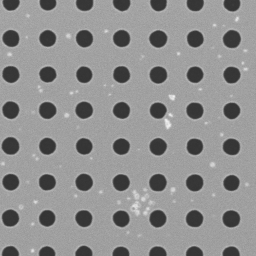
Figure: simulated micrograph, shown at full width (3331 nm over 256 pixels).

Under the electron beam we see a regular array of holes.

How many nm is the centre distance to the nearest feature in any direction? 467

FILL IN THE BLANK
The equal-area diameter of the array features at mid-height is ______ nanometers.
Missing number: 222